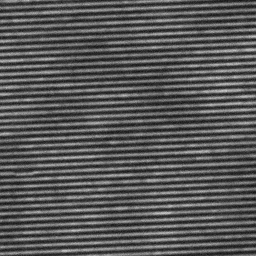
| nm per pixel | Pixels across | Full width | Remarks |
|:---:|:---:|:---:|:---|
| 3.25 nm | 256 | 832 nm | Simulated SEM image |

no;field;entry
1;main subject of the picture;parallel lines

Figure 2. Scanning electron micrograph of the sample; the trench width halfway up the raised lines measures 14.6 nm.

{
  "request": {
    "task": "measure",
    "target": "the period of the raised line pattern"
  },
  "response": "21.5 nanometres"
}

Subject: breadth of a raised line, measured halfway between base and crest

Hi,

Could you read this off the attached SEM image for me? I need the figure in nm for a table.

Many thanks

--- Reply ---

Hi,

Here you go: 5.7